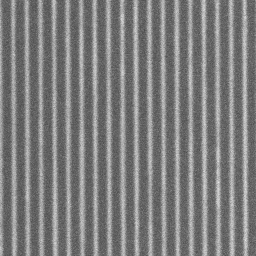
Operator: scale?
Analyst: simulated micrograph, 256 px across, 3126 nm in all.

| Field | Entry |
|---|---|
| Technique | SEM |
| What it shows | parallel lines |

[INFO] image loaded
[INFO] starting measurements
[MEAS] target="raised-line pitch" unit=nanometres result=166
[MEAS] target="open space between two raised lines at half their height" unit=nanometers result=139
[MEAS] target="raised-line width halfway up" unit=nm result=32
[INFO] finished